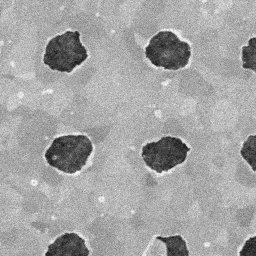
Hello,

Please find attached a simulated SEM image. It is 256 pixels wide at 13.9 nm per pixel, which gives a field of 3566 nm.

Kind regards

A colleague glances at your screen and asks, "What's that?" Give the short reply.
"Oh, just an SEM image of holes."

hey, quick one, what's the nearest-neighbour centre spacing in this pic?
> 97.7 pixels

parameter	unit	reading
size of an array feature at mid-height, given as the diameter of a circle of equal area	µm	0.585